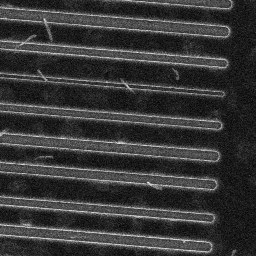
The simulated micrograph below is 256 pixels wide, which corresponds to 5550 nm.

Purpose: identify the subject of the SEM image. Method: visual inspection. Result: parallel lines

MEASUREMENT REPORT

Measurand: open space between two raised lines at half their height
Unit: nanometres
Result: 189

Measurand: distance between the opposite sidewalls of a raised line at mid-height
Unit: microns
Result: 0.489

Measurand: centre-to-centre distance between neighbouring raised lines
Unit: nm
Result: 666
